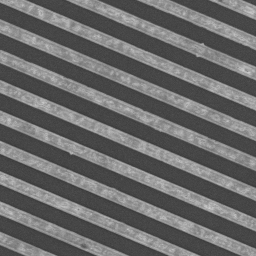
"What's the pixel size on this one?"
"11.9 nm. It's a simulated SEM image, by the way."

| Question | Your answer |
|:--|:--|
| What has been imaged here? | parallel lines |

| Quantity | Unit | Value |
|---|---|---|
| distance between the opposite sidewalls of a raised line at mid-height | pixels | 11.5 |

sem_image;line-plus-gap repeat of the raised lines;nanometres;332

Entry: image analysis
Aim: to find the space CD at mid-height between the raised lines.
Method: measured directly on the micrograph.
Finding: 196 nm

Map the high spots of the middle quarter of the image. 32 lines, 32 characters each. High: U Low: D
DDDDUUUUUUUDDDDDDDDDDDUUUUUUUDDD
DDDDDDUUUUUUUUDDDDDDDDDDUUUUUUUU
DDDDDDDDDUUUUUUUDDDDDDDDDDDUUUUU
DDDDDDDDDDDUUUUUUUDDDDDDDDDDDUUU
UUUDDDDDDDDDDUUUUUUUUDDDDDDDDDDU
UUUUUDDDDDDDDDDDUUUUUUUDDDDDDDDD
UUUUUUUDDDDDDDDDDDUUUUUUUDDDDDDD
DDUUUUUUUUDDDDDDDDDDUUUUUUUUDDDD
DDDDDUUUUUUUDDDDDDDDDDDUUUUUUUDD
DDDDDDDUUUUUUUDDDDDDDDDDDUUUUUUU
DDDDDDDDDDUUUUUUUDDDDDDDDDDDUUUU
UDDDDDDDDDDDUUUUUUUDDDDDDDDDDDUU
UUUUDDDDDDDDDDUUUUUUUUDDDDDDDDDD
UUUUUUDDDDDDDDDDDUUUUUUUDDDDDDDD
DDUUUUUUDDDDDDDDDDDUUUUUUUDDDDDD
DDDDUUUUUUUDDDDDDDDDDUUUUUUUUDDD
DDDDDDUUUUUUUDDDDDDDDDDDUUUUUUUD
DDDDDDDDDUUUUUUDDDDDDDDDDDUUUUUU
DDDDDDDDDDDUUUUUUUDDDDDDDDDDDUUU
UUDDDDDDDDDDDUUUUUUUDDDDDDDDDDDU
UUUUUDDDDDDDDDDDUUUUUUUDDDDDDDDD
UUUUUUUDDDDDDDDDDDUUUUUUUDDDDDDD
DDDUUUUUUDDDDDDDDDDDDUUUUUUDDDDD
DDDDDUUUUUUUDDDDDDDDDDDUUUUUUUDD
DDDDDDDUUUUUUUDDDDDDDDDDDUUUUUUU
DDDDDDDDDDUUUUUUDDDDDDDDDDDDUUUU
UDDDDDDDDDDDUUUUUUUDDDDDDDDDDDUU
UUUDDDDDDDDDDDUUUUUUUDDDDDDDDDDD
UUUUUDDDDDDDDDDDDUUUUUUDDDDDDDDD
DUUUUUUUDDDDDDDDDDDUUUUUUUDDDDDD
DDDDUUUUUUDDDDDDDDDDDDUUUUUUDDDD
DDDDDDUUUUUUUDDDDDDDDDDDUUUUUUUD